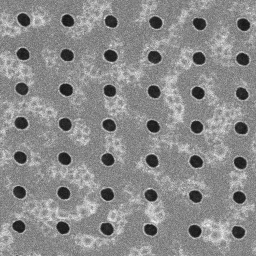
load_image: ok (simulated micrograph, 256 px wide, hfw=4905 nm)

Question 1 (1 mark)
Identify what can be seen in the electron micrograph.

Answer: a regular array of holes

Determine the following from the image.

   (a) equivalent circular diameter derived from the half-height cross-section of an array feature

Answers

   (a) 13.3 pixels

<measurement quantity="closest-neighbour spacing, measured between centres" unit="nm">659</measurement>